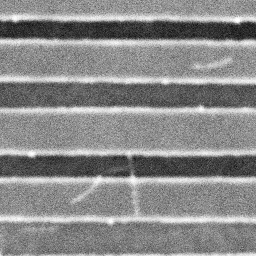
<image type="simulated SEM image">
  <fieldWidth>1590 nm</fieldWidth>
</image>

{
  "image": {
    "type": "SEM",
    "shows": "lines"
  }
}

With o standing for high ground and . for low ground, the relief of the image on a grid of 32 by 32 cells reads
oooooooooooooooooooooooooooooooo
oooooooooooooooooooooooooooooooo
.........................ooooooo
................................
................................
oooooooooooooooooooooooooooooooo
oooooooooooooooooooooooooooooooo
oooooooooooooooooooooooooooooooo
oooooooooooooooooooooooooooooooo
oooooooooooooooooooooooooooooooo
................................
................................
................................
................................
oooooooooooooooooooooooooooooooo
oooooooooooooooooooooooooooooooo
oooooooooooooooooooooooooooooooo
oooooooooooooooooooooooooooooooo
oooooooooooooooooooooooooooooooo
................................
................................
................................
oooooooooooooooooooooooooooooooo
oooooooooooooooooooooooooooooooo
oooooooooooooooooooooooooooooooo
oooooooooooooooooooooooooooooooo
oooooooooooooooooooooooooooooooo
oooooooooooooooooooooooooooooooo
................................
................................
................................
................................